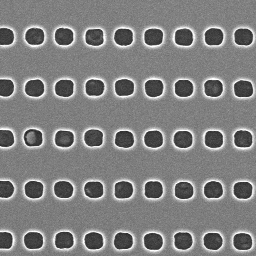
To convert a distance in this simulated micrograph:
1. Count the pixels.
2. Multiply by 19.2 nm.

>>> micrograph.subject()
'a regular array of holes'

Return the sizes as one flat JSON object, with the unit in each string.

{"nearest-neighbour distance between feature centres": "566 nm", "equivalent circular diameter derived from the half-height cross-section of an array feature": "365 nm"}